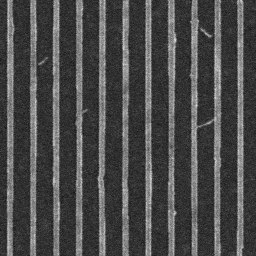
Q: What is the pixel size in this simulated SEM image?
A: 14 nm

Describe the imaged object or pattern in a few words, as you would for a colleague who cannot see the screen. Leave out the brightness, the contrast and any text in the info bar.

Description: parallel lines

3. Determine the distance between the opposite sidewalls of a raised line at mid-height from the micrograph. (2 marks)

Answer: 64.7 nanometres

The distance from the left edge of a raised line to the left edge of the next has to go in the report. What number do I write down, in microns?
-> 0.322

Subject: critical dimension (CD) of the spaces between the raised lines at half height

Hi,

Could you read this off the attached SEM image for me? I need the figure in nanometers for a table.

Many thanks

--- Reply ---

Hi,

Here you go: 259